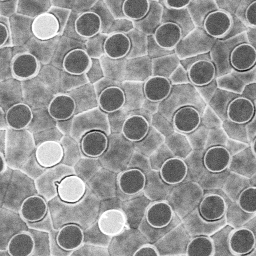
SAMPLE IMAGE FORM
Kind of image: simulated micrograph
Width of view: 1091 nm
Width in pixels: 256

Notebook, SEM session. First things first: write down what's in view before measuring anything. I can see a regular array of raised bodies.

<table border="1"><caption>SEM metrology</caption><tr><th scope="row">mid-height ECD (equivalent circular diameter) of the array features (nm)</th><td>110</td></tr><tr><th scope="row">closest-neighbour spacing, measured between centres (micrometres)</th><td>0.123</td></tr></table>